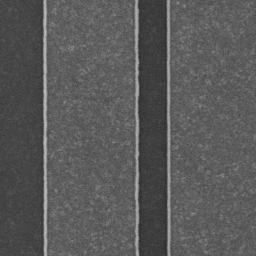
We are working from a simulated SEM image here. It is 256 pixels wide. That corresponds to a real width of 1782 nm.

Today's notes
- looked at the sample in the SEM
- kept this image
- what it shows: one or a few lines or trenches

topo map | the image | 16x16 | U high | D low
DDDUUUUUUDDUUUUU
DDDUUUUUUDUUUUUU
DDDUUUUUUDUUUUUU
DDDUUUUUUDUUUUUU
DDDUUUUUUDDUUUUU
DDDUUUUUUDDUUUUU
DDDUUUUUUDDUUUUU
DDDUUUUUUDDUUUUU
DDDUUUUUUDDUUUUU
DDDUUUUUUDDUUUUU
DDDUUUUUUDDUUUUU
DDDUUUUUUDDUUUUU
DDDUUUUUUDDUUUUU
DDDUUUUUUDDUUUUU
DDDUUUUUUDDUUUUU
DDDUUUUUUDDUUUUU